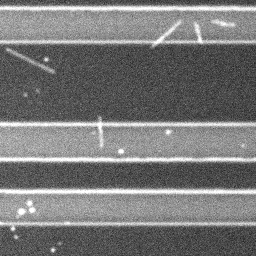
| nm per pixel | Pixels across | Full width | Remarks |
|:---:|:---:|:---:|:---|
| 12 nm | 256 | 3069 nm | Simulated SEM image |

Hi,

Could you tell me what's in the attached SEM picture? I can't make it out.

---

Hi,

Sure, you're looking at lines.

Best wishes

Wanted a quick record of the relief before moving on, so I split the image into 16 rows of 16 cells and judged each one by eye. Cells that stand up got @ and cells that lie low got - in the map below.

@@@@@@@@@@@@@@@@
----------------
----------------
@@@@@@@@@@@@@@@@
@@@@@@@@@@@@@@@@
@@@@@@@@@@@@@@@@
@@@@@@@@@@@@@@@@
@@@@@@@@@@@@@@@@
----------------
----------------
@@@@@@@@@@@@@@@@
@@@@@@@@@@@@@@@@
----------------
----------------
@@@@@@@@@@@@@@@@
@@@@@@@@@@@@@@@@